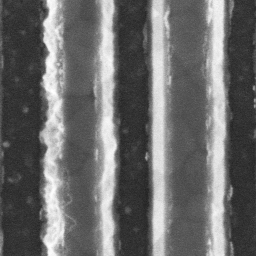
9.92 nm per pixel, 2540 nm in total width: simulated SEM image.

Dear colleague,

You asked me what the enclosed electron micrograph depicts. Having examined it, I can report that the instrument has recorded one or a few lines or trenches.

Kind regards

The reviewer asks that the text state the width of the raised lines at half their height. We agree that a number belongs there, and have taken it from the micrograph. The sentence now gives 593 nm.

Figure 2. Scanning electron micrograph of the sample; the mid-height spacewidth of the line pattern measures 491 nm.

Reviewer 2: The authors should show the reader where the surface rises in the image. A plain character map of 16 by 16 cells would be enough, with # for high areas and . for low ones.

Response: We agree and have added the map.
...####...####..
...####...####..
...####...####..
...####...####..
...####...####..
...####...####..
...####...####..
...####...####..
...####...####..
...####...####..
...####...####..
...####...####..
...####...####..
...####...####..
...####...####..
...####...####..